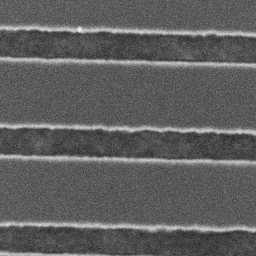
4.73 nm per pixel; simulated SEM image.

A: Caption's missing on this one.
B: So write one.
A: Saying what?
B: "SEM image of lines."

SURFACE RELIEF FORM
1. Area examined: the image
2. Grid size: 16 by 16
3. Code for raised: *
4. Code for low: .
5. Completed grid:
****************
****************
................
................
****************
****************
****************
****************
................
................
****************
****************
****************
****************
................
................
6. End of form